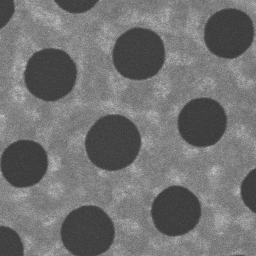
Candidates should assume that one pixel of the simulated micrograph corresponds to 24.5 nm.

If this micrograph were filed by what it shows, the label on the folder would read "holes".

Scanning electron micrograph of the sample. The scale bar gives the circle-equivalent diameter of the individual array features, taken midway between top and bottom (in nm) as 1290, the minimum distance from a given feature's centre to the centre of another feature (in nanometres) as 2240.